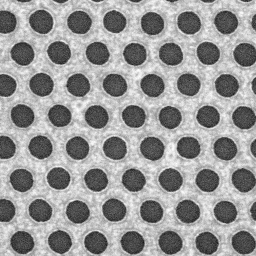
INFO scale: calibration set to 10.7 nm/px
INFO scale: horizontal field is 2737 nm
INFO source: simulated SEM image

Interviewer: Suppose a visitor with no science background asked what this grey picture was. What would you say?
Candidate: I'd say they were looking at a regular array of holes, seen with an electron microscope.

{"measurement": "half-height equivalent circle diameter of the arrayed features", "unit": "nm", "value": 260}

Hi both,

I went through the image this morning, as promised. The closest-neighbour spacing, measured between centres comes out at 381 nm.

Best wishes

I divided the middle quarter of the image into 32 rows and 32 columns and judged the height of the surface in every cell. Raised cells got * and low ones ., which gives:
******************.*************
********************************
***..*******.********..*******..
*.....****.....****.....****....
*.....****......***......***....
.......***......***......***....
*.....****......***......***....
**....*****....*****....******..
**********************.*********
********************************
.******..*******...*******.*****
..***......****.....****.....***
..***......***......****.....***
..***......***.......***......**
..***......****.....****.....***
.*****.....*****....*****....***
********************************
********************************
**...******...******...******...
*.....****......***......***....
......****......***......***....
.......***......***......***....
*.....****......***......****...
**...******....*****....******..
********************************
********************************
.*****....******...******...****
..***......****.....****.....***
..***......***......***.......**
..***......***.......***......**
.****......****.....****......**
******....******...******....***